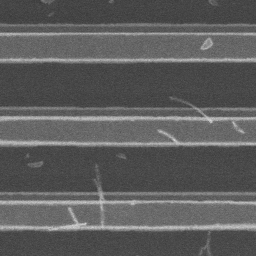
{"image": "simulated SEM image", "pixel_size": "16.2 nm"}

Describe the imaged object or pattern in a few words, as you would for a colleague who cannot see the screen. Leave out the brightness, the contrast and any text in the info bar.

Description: lines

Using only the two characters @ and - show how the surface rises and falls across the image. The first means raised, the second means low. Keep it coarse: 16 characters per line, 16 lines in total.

----------------
----------------
@@@@@@@@@@@@@@@@
@@@@@@@@@@@@@@@@
----------------
----------------
----------------
@@@@@@@@@@@@@@@@
@@@@@@@@@@@@@@@@
----------------
----------------
----------------
@@@@@@@@@@@@@@@@
@@@@@@@@@@@@@@@@
----------------
----------------